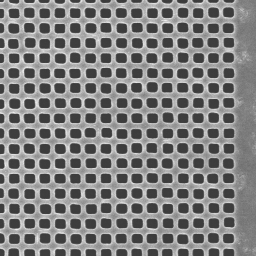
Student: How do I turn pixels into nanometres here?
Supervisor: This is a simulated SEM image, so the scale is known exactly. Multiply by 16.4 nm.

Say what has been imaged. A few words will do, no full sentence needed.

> a regular array of holes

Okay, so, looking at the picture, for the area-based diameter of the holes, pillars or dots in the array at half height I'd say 187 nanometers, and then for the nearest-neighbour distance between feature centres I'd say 239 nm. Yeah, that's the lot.